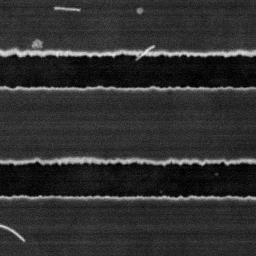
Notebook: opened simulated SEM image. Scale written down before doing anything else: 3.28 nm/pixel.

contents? lines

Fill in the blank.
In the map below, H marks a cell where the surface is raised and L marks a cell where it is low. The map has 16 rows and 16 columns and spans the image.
HHHHHHHHHHHHHHHH
HHHHHHHHHHHHHHHH
HHHHHHHHHHHHHHHH
LLLLLLLLLLLLLLLL
LLLLLLLLLLLLLLLL
HHHHHHHHLHHHHHHH
HHHHHHHHHHHHHHHH
HHHHHHHHHHHHHHHH
HHHHHHHHHHHHHHHH
HHHHHHHHHHHHHHHH
LLLLLLLLLLLLLLLL
LLLLLLLLLLLLLLLL
HHHHHHHHHHHHHHHH
HHHHHHHHHHHHHHHH
HHHHHHHHHHHHHHHH
HHHHHHHHHHHHHHHH